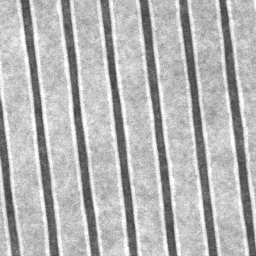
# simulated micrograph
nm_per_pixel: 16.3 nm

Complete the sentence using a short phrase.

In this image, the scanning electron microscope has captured parallel lines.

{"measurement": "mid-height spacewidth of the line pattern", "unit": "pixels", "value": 10.9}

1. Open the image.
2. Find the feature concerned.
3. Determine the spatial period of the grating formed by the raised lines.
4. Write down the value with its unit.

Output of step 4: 638 nm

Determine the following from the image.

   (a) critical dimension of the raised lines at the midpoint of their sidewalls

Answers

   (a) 458 nm